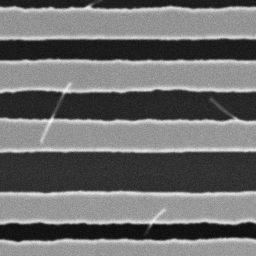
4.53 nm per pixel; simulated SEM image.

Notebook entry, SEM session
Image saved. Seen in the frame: lines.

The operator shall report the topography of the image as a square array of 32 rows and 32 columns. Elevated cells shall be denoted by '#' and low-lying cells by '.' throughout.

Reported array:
................................
################################
################################
################################
################################
................................
................................
.....###.#......................
################################
################################
################################
##.....####....#................
................................
................................
................................
################################
################################
################################
################################
................................
................................
................................
................................
................................
################################
################################
################################
################################
................................
................................
################################
################################